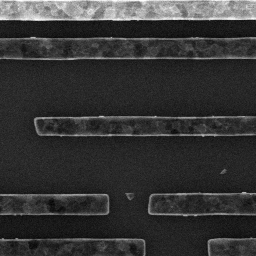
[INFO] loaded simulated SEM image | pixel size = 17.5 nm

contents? wiring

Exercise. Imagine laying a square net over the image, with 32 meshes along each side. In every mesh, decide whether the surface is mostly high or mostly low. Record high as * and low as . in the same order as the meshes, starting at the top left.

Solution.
********************************
********************************
................................
................................
................................
********************************
********************************
................................
................................
................................
................................
................................
................................
................................
................................
....****************************
.....***************************
................................
................................
................................
................................
................................
................................
................................
*************......*************
**************.....*************
*************......*************
................................
................................
................................
******************........******
******************........******